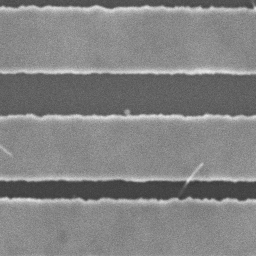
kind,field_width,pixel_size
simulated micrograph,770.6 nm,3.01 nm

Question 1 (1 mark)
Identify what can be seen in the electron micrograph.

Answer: lines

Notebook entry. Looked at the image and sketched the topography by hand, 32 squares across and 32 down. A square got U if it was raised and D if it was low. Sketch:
DDDDDDDDDDDDDDDDDDDDDDDDDDDDDDDD
UUUUUUUUUUUUUUUUUUUUUUUUUUUUUUUU
UUUUUUUUUUUUUUUUUUUUUUUUUUUUUUUU
UUUUUUUUUUUUUUUUUUUUUUUUUUUUUUUU
UUUUUUUUUUUUUUUUUUUUUUUUUUUUUUUU
UUUUUUUUUUUUUUUUUUUUUUUUUUUUUUUU
UUUUUUUUUUUUUUUUUUUUUUUUUUUUUUUU
UUUUUUUUUUUUUUUUUUUUUUUUUUUUUUUU
UUUUUUUUUUUUUUUUUUUUUUUUUUUUUUUU
DDDDDDDDDDDDDDDDDDDDDDDDDDDDDDDD
DDDDDDDDDDDDDDDDDDDDDDDDDDDDDDDD
DDDDDDDDDDDDDDDDDDDDDDDDDDDDDDDD
DDDDDDDDDDDDDDDDDDDDDDDDDDDDDDDD
DDDDDDDDDDDDDDDDDDDDDDDDDDDDDDDD
UUUUUUUUUUUUUUUUUUUUUUUDUUUUUUUU
UUUUUUUUUUUUUUUUUUUUUUUUUUUUUUUU
UUUUUUUUUUUUUUUUUUUUUUUUUUUUUUUU
UUUUUUUUUUUUUUUUUUUUUUUUUUUUUUUU
UUUUUUUUUUUUUUUUUUUUUUUUUUUUUUUU
UUUUUUUUUUUUUUUUUUUUUUUUUUUUUUUU
UUUUUUUUUUUUUUUUUUUUUUUUUUUUUUUU
UUUUUUUUUUUUUUUUUUUUUUUUUUUUUUUU
UUUUUUUUUUUUUUDUUUUUUUUUUUUUUUUU
DDDDDDDDDDDDDDDDDDDDDDDDDDDDDDDD
DDDDDDDDDDDDDDDDDDDDDDDDDDDDDDDD
UUUUUUUUUUUUUUUUUUUUUUUUUUUUUUUU
UUUUUUUUUUUUUUUUUUUUUUUUUUUUUUUU
UUUUUUUUUUUUUUUUUUUUUUUUUUUUUUUU
UUUUUUUUUUUUUUUUUUUUUUUUUUUUUUUU
UUUUUUUUUUUUUUUUUUUUUUUUUUUUUUUU
UUUUUUUUUUUUUUUUUUUUUUUUUUUUUUUU
UUUUUUUUUUUUUUUUUUUUUUUUUUUUUUUU